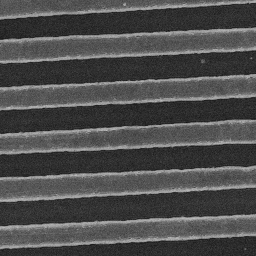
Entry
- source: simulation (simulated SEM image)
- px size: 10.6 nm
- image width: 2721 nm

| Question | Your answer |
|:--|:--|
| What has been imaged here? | lines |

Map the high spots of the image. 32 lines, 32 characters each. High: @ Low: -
@@@@@@@@@@@@@@@@@@@@@@@@@@@@@---
@@@@@@@@@@@@@@------------------
--------------------------------
-------------------------------@
---------@@@@@@@@@@@@@@@@@@@@@@@
@@@@@@@@@@@@@@@@@@@@@@@@@@@@@@@@
@@@@@@@@@@@@@@@@@@@@@@@@@@------
@@@@@@@-------------------------
--------------------------------
-----------------------------@@@
----------@@@@@@@@@@@@@@@@@@@@@@
@@@@@@@@@@@@@@@@@@@@@@@@@@@@@@@@
@@@@@@@@@@@@@@@@@@@@@@@@@-------
@@@@----------------------------
--------------------------------
----------------------@@@@@@@@@@
-----@@@@@@@@@@@@@@@@@@@@@@@@@@@
@@@@@@@@@@@@@@@@@@@@@@@@@@@@@@@@
@@@@@@@@@@@@@@@@@---------------
--------------------------------
--------------------------------
-----------------@@@@@@@@@@@@@@@
@@@@@@@@@@@@@@@@@@@@@@@@@@@@@@@@
@@@@@@@@@@@@@@@@@@@@@@@@@@@@@---
@@@@@@@@@@@@--------------------
--------------------------------
--------------------------------
------------------@@@@@@@@@@@@@@
@@@@@@@@@@@@@@@@@@@@@@@@@@@@@@@@
@@@@@@@@@@@@@@@@@@@@@@@@@@@@@@@-
@@@@@@@@@@@---------------------
--------------------------------